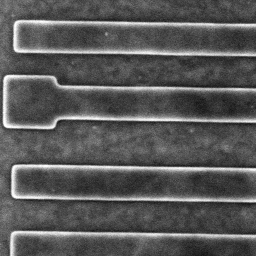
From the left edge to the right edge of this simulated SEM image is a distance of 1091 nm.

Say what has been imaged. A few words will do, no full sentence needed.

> wiring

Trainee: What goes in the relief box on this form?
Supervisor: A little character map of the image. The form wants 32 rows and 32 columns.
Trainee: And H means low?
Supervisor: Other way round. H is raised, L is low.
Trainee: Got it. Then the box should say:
LLLLLLLLLLLLLLLLLLLLLLLLLLLLLLLL
LLLLLLLLLLLLLLLLLLLLLLLLLLLLLLLL
LLLLLLLLLLLLLLLLLLLLLLLLLLLLLLLL
LLHHHHHHHHHHHHHHHHHHHHHHHHHHHHHH
LLHHHHHHHHHHHHHHHHHHHHHHHHHHHHHH
LLHHHHHHHHHHHHHHHHHHHHHHHHHHHHHH
LLHHHHHHHHHHHHHHHHHHHHHHHHHHHHHH
LLLLLLLLLLLLLLLLLLLLLLLLLLLLLLLL
LLLLLLLLLLLLLLLLLLLLLLLLLLLLLLLL
LHHHHHLLLLLLLLLLLLLLLLLLLLLLLLLL
HHHHHHHLLLLLLLLLLLLLLLLLLLLLLLLL
HHHHHHHHHHHHHHHHHHHHHHHHHHHHHHHH
HHHHHHHHHHHHHHHHHHHHHHHHHHHHHHHH
HHHHHHHHHHHHHHHHHHHHHHHHHHHHHHHH
HHHHHHHHHHHHHHHHHHHHHHHHHHHHHHHH
HHHHHHHLLLLLLLLLLLLLLLLLLLLLLLLL
LLLLLLLLLLLLLLLLLLLLLLLLLLLLLLLL
LLLLLLLLLLLLLLLLLLLLLLLLLLLLLLLL
LLLLLLLLLLLLLLLLLLLLLLLLLLLLLLLL
LLLLLLLLLLLLLLLLLLLLLLLLLLLLLLLL
LLLLLLLLLLLLLLLLLLLLLLLLLLLLLLLL
LHHHHHHHHHHHHHHHHHHHHHHHHHHHHHHH
LHHHHHHHHHHHHHHHHHHHHHHHHHHHHHHH
LHHHHHHHHHHHHHHHHHHHHHHHHHHHHHHH
LLHHHHHHHHHHHHHHHHHHHHHHHHHHHHHH
LLLLLLLLLLLLLLLLLLLLLLLLLLLLLLLL
LLLLLLLLLLLLLLLLLLLLLLLLLLLLLLLL
LLLLLLLLLLLLLLLLLLLLLLLLLLLLLLLL
LLLLLLLLLLLLLLLLLLLLLLLLLLLLLLLL
LHHHHHHHHHHHHHHHHHHHHHHHHHHHHHHH
LHHHHHHHHHHHHHHHHHHHHHHHHHHHHHHH
LHHHHHHHHHHHHHHHHHHHHHHHHHHHHHHH